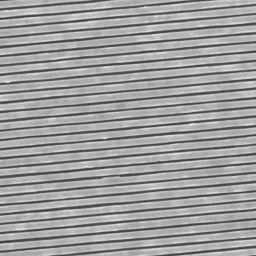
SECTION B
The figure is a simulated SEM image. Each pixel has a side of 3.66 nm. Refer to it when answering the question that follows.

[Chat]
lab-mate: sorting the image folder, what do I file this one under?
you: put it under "parallel lines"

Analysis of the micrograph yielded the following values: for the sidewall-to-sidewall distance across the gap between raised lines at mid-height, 10 nanometres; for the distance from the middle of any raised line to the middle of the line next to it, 33.9 nanometres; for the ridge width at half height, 23.2 nm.